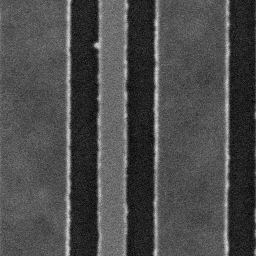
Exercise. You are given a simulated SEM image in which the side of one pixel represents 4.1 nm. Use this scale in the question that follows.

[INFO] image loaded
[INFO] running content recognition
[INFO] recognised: lines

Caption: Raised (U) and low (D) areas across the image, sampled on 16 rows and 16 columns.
UUUUDDUUDDUUUUDD
UUUUDDUUDDUUUUDD
UUUUDDUUDDUUUUDD
UUUUDDUUDDUUUUDD
UUUUDDUUDDUUUUDD
UUUUDDUUDDUUUUDD
UUUUDDUUDDUUUUDD
UUUUDDUUDDUUUUDD
UUUUDDUUDDUUUUDD
UUUUDDUUDDUUUUDD
UUUUDDUUDDUUUUDD
UUUUDDUUDDUUUUDD
UUUUDDUUDDUUUUDD
UUUUDDUUDDUUUUDD
UUUUDDUUDDUUUUDD
UUUUDDUUDDUUUUDD